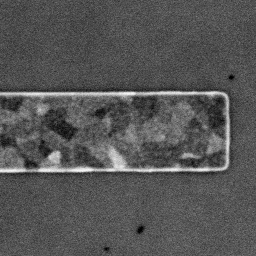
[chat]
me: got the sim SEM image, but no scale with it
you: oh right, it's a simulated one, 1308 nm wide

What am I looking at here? wiring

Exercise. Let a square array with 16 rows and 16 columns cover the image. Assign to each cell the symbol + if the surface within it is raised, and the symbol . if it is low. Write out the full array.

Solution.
................
................
................
................
................
................
++++++++++++++..
++++++++++++++..
++++++++++++++..
++++++++++++++..
++++++++++++++..
................
................
................
................
................